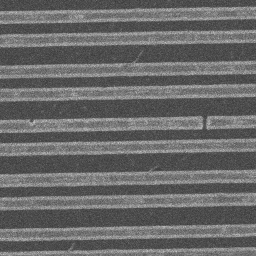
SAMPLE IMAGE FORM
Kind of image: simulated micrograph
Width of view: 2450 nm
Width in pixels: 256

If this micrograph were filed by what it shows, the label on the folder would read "parallel lines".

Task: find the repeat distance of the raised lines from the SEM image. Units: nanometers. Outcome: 260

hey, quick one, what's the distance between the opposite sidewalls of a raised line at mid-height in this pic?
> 10.1 pixels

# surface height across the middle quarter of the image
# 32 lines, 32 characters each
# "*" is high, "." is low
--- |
*....***************************
********************************
********************............
................................
................................
................................
********************************
********************************
*****...........................
................................
................................
................................
................................
...............................*
********************************
********************************
.****...........................
................................
................................
............................****
********************************
********************************
................................
................................
................................
................................
................................
................****************
********************************
*******************************.
................................
................................